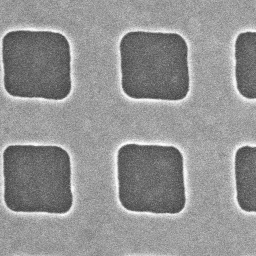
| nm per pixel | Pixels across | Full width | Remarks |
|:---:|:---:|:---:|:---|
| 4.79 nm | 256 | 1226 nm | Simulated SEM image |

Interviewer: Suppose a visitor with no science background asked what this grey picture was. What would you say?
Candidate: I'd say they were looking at holes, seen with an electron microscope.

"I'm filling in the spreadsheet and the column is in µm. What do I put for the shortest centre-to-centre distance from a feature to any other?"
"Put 0.542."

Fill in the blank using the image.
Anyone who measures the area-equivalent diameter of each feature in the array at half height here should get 361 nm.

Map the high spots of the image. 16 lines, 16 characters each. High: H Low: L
HHHHHHHHHHHHHHHH
HHHHHHHHHHHHHHHH
LLLLHHHHLLLHHHHL
LLLLHHHHLLLLHHHL
LLLLHHHHLLLLHHHL
LLLLHHHHLLLLHHHL
HHHHHHHHHHHHHHHH
HHHHHHHHHHHHHHHH
HHHHHHHHHHHHHHHH
LLLLHHHLLLLHHHHL
LLLLHHHLLLLLHHHL
LLLLHHHLLLLLHHHL
LLLLLHHLLLLLHHHL
HHHHHHHHHHHHHHHH
HHHHHHHHHHHHHHHH
HHHHHHHHHHHHHHHH